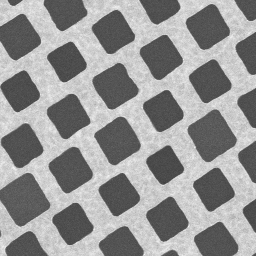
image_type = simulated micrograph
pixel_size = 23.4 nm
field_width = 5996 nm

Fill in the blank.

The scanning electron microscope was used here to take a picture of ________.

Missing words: a regular array of holes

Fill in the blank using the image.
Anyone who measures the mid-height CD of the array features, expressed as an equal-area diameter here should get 0.91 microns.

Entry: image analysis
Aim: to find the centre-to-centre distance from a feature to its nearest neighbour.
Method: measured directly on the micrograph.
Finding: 1260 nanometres